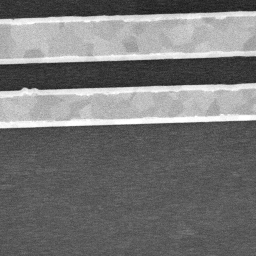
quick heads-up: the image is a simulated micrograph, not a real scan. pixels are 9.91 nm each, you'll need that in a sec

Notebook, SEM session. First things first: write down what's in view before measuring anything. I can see one or a few lines or trenches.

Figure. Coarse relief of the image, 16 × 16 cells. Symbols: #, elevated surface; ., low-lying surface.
................
################
################
###########.....
................
............####
################
###########.....
................
................
................
................
................
................
................
................